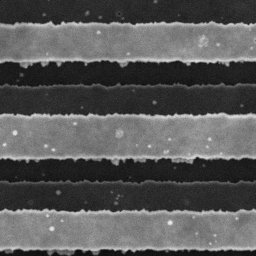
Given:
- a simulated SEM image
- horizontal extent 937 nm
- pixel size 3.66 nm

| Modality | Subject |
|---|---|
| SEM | lines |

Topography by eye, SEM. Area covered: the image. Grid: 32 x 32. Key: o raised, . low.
................................
................................
................................
oooooooooooooooooooooooooooooooo
oooooooooooooooooooooooooooooooo
oooooooooooooooooooooooooooooooo
oooooooooooooooooooooooooooooooo
oooooooooooooooooooooooooooooooo
................................
................................
................................
................................
................................
................................
oooooooooooooooooooooooooooooooo
oooooooooooooooooooooooooooooooo
oooooooooooooooooooooooooooooooo
oooooooooooooooooooooooooooooooo
oooooooooooooooooooooooooooooooo
oooooooooooooooooooooooooooooooo
................................
................................
................................
................................
................................
................................
ooooooooo.oooooooooooooooooooooo
oooooooooooooooooooooooooooooooo
oooooooooooooooooooooooooooooooo
oooooooooooooooooooooooooooooooo
oooooooooooooooooooooooooooooooo
................................